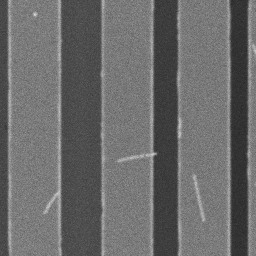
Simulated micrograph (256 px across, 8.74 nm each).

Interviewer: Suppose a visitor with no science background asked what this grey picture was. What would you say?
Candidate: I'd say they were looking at lines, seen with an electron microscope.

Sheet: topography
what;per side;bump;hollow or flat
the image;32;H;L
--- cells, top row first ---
LHHHHHHHLLLLLHHHHHHLLLHHHHHHHLLH
LHHHHHHHLLLLLHHHHHHLLLHHHHHHHLLH
LHHHHHHHLLLLLHHHHHHLLLHHHHHHHLLH
LHHHHHHHLLLLLHHHHHHLLLHHHHHHHLLH
LHHHHHHHLLLLLHHHHHHLLLHHHHHHHLLH
LHHHHHHHLLLLLHHHHHHLLLHHHHHHHLLH
LHHHHHHHLLLLLHHHHHHLLLHHHHHHHLLH
LHHHHHHHLLLLLHHHHHHLLLHHHHHHHLLH
LHHHHHHHLLLLLHHHHHHLLLHHHHHHHLLH
LHHHHHHHLLLLLHHHHHHLLLHHHHHHHLLH
LHHHHHHHLLLLLHHHHHHLLLHHHHHHHLLH
LHHHHHHHLLLLLHHHHHHLLLHHHHHHHLLH
LHHHHHHHLLLLLHHHHHHLLLHHHHHHHLLH
LHHHHHHHLLLLLHHHHHHLLLHHHHHHHLLH
LHHHHHHHLLLLLHHHHHHLLLHHHHHHHLLH
LHHHHHHHLLLLLHHHHHHLLLHHHHHHHLLH
LHHHHHHHLLLLLHHHHHHLLLHHHHHHHLLH
LHHHHHHHLLLLLHHHHHHLLLHHHHHHHLLH
LHHHHHHHLLLLLHHHHHHLLLHHHHHHHLLH
LHHHHHHHLLLLLHHHHHHLLLHHHHHHHLLH
LHHHHHHHLLLLLHHHHHHLLLHHHHHHHLLH
LHHHHHHHLLLLLHHHHHHLLLHHHHHHHLLH
LHHHHHHHLLLLLHHHHHHLLLHHHHHHHLLH
LHHHHHHHLLLLLHHHHHHLLLHHHHHHHLLH
LHHHHHHHLLLLLHHHHHHLLLHHHHHHHLLH
LHHHHHHHLLLLLHHHHHHLLLHHHHHHHLLH
LHHHHHHHLLLLLHHHHHHLLLHHHHHHHLLH
LHHHHHHHLLLLLHHHHHHLLLHHHHHHHLLH
LHHHHHHHLLLLLHHHHHHLLLHHHHHHHLLH
LHHHHHHHLLLLLHHHHHHLLLHHHHHHHLLH
LHHHHHHHLLLLLHHHHHHLLLHHHHHHHLLH
LHHHHHHHLLLLLHHHHHHLLLHHHHHHHLLH